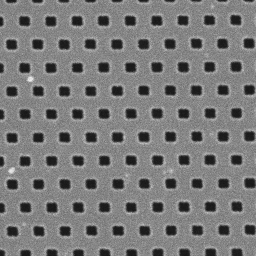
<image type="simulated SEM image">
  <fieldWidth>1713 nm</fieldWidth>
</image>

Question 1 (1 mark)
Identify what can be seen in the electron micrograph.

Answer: a regular array of holes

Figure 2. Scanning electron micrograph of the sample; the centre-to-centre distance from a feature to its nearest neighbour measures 176 nm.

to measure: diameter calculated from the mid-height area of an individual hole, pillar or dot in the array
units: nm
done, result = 78.1